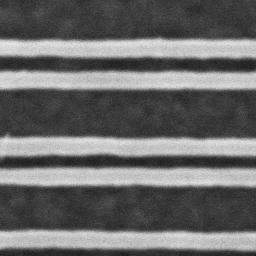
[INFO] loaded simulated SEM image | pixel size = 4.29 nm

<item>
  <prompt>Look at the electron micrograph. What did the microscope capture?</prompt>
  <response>lines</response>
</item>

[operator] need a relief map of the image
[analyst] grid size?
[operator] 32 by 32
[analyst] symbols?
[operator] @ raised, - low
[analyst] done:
--------------------------------
--------------------------------
--------------------------------
--------------------------------
--------------------------------
@@@@@@@@@@@@@@@@@@@@@@@@@@@@@@@@
@@@@@@@@@@@@@@@@@@@@@@@@@@@@@@@@
--------------------------------
--------------------------------
@@@@@@@@@@@@@@@@@@@@@@@@@@@@@@@@
@@@@@@@@@@@@@@@@@@@@@@@@@@@@@@@@
--------------------------------
--------------------------------
--------------------------------
--------------------------------
--------------------------------
--------------------------------
@@@@@@@@@@@@@@@@@@@@@@@@@@@@@@@@
@@@@@@@@@@@@@@@@@@@@@@@@@@@@@@@@
@-------------------------------
--------------------------------
@@@@@@@@@@@@@@@@@@@@@@@@@@@@@@@@
@@@@@@@@@@@@@@@@@@@@@@@@@@@@@@@@
--------------------------------
--------------------------------
--------------------------------
--------------------------------
--------------------------------
--------------------------------
@@@@@@@@@@@@@@@@@@@@@@@@@@@@@@@@
@@@@@@@@@@@@@@@@@@@@@@@@@@@@@@@@
--------------------------------